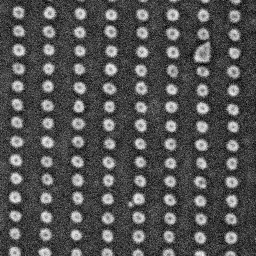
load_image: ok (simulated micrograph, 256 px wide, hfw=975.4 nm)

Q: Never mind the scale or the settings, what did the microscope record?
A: a regular array of raised bodies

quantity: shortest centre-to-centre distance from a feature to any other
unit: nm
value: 68.9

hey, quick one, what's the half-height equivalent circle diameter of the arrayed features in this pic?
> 33.8 nm